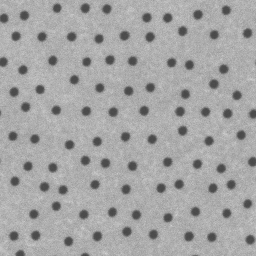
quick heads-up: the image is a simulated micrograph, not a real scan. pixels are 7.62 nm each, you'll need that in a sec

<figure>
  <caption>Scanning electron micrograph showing a regular array of holes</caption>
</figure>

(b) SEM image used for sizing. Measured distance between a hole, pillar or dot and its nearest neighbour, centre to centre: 168 nm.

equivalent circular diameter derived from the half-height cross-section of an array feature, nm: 71.5